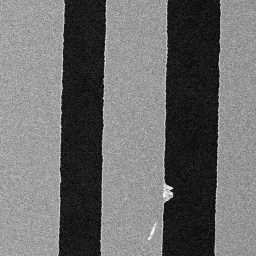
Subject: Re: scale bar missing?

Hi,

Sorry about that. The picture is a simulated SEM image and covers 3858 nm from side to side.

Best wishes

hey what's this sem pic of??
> one or a few lines or trenches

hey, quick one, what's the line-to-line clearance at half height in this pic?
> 648 nanometres